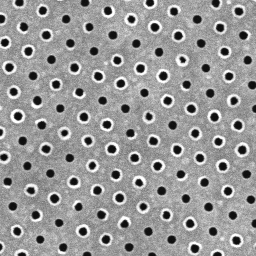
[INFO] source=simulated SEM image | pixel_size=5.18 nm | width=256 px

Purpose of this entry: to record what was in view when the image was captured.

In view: a regular array of holes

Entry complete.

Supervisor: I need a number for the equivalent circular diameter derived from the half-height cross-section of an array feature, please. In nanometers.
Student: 44.1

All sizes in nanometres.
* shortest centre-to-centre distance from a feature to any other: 126